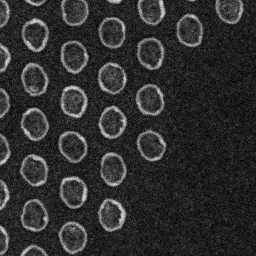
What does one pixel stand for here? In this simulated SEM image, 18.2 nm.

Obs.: a regular array of raised bodies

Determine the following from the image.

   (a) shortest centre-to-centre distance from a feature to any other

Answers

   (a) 804 nanometres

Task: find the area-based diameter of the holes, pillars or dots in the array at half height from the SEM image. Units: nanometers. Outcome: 504